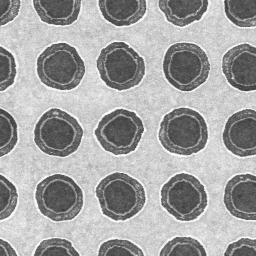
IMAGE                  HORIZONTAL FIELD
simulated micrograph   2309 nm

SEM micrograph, ring-shaped grooves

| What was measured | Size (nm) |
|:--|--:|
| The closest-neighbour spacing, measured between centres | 572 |